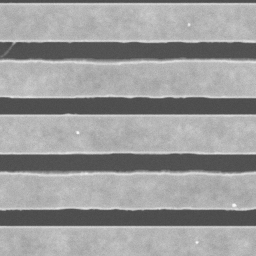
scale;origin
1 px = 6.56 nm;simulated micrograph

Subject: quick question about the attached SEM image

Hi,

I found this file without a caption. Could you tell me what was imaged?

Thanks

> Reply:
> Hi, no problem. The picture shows lines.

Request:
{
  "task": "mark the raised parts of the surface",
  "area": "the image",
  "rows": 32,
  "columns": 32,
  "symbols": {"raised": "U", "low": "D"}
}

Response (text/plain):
UUUUUUUUUUUUUUUUUUUUUUUUUUUUUUUU
UUUUUUUUUUUUUUUUUUUUUUUUUUUUUUUU
UUUUUUUUUUUUUUUUUUUUUUUUUUUUUUUU
UUUUUUUUUUUUUUUUUUUUUUUUUUUUUUUU
UUUUUUUUUUUUUUUUUUUUUUUUUUUUUUUU
DDDDDDDDDDDDDDDDDDDDDDDDDDDDDDDD
DDDDDDDDDDDDDDDDDDDDDDDDDDDDDDDD
UUUUUUDDUUUDDDDDDUUUDUUUUUUUUUUU
UUUUUUUUUUUUUUUUUUUUUUUUUUUUUUUU
UUUUUUUUUUUUUUUUUUUUUUUUUUUUUUUU
UUUUUUUUUUUUUUUUUUUUUUUUUUUUUUUU
UUUUUUUUUUUUUUUUUUUUUUUUUUUUUUUU
DDDDDDDDDDDDDDDDDDDDDDDDDDDDDDDD
DDDDDDDDDDDDDDDDDDDDDDDDDDDDDDDD
UUUUUUUUUUUUUUUUUUUUUUUUUUUUUUUU
UUUUUUUUUUUUUUUUUUUUUUUUUUUUUUUU
UUUUUUUUUUUUUUUUUUUUUUUUUUUUUUUU
UUUUUUUUUUUUUUUUUUUUUUUUUUUUUUUU
UUUUUUUUUUUUUUUUUUUUUUUUUUUUUUUU
DDDDDDDDDDDDDDDDDDDDDDDDDDDDDDDD
DDDDDDDDDDDDDDDDDDDDDDDDDDDDDDDD
DDDDDDDDDDDDDDDDDUUDUDDUUUDDDDDU
UUUUUUUUUUUUUUUUUUUUUUUUUUUUUUUU
UUUUUUUUUUUUUUUUUUUUUUUUUUUUUUUU
UUUUUUUUUUUUUUUUUUUUUUUUUUUUUUUU
UUUUUUUUUUUUUUUUUUUUUUUUUUUUUUUU
DDDDDDDDDDDDDDDDDDDDDDDDDDDDDDDD
DDDDDDDDDDDDDDDDDDDDDDDDDDDDDDDD
UUUUUUUUUUUUUUUUUUUUUUUUUUUUUUUU
UUUUUUUUUUUUUUUUUUUUUUUUUUUUUUUU
UUUUUUUUUUUUUUUUUUUUUUUUUUUUUUUU
UUUUUUUUUUUUUUUUUUUUUUUUUUUUUUUU